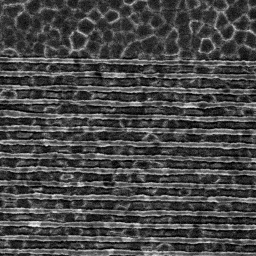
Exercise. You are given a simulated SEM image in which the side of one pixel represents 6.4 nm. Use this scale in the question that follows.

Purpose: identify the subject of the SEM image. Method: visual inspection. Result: parallel lines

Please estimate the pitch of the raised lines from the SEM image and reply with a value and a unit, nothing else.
0.0874 micrometres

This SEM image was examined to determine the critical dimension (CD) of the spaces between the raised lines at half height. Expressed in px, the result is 9.62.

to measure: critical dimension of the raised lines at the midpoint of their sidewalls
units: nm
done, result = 28